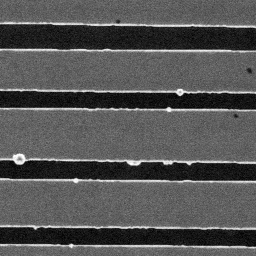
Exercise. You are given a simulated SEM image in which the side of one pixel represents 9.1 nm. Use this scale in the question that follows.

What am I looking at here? lines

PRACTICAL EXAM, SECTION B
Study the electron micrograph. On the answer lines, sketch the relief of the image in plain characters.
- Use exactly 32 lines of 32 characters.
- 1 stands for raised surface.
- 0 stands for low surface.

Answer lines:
11111111111111111111111111111111
11111111111111111111111111111111
11111111111111111111111111111111
00000000000000000000000000000000
00000000000000000000000000000000
00000000000000000000000000000000
11111111111111111111111111111111
11111111111111111111111111111111
11111111111111111111111111111111
11111111111111111111111111111111
11111111111111111111111111111111
00000000000000000000001110111111
00000000000000000000000000000000
00000000000000000000000000000000
11111111111111111111111111111111
11111111111111111111111111111111
11111111111111111111111111111111
11111111111111111111111111111111
11111111111111111111111111111111
11111111111111111111111111111111
00100000000000000000000000000000
00000000000000000000000000000000
11111111111100000000000000000000
11111111111111111111111111111111
11111111111111111111111111111111
11111111111111111111111111111111
11111111111111111111111111111111
11111111111111111111111111111111
00000000000010011101111111111111
00000000000000000000000000000000
00000000000000000000000000000000
11111111111111111111111111111111